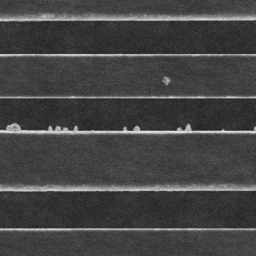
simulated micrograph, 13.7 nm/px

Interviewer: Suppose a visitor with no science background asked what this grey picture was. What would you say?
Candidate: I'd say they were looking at lines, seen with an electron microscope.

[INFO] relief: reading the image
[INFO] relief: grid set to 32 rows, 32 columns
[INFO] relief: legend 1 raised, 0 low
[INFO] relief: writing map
11111111111111111111111111111111
11111111111111111111111111111111
00000000000000000000000000000000
00000000000000000000000000000000
00000000000000000000000000000000
00000000000000000000000000000000
00000000000000000000000000000000
11111111111111111111111111111111
11111111111111111111111111111111
11111111111111111111111111111111
11111111111111111111111111111111
11111111111111111111111111111111
00000000000000000000000000000000
00000000000000000000000000000000
00000000000000000000000000000000
00000000000000000000000000000000
11111100000000010000000100000000
11111111111111111111111111111111
11111111111111111111111111111111
11111111111111111111111111111111
11111111111111111111111111111111
11111111111111111111111111111111
11111111111111111111111111111111
11111111111111111111111111111111
00000000000000000000000000000000
00000000000000000000000000000000
00000000000000000000000000000000
00000000000000000000000000000000
00000000000000000000000000000000
11111111111111111111111111111111
11111111111111111111111111111111
11111111111111111111111111111111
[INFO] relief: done